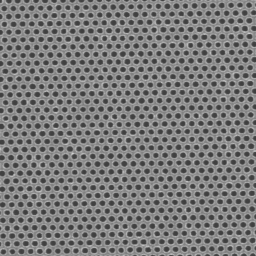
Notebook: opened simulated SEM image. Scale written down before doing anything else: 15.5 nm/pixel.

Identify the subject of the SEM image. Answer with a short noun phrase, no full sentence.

a regular array of holes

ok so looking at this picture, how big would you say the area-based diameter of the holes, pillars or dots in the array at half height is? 90.9 nm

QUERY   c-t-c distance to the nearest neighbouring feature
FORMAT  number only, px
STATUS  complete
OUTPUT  8.81